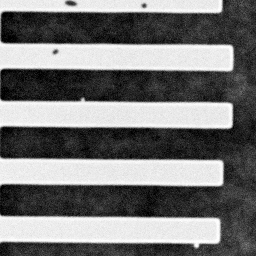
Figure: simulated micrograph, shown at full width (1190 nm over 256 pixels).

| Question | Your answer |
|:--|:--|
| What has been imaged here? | groups of lines, slits or small figures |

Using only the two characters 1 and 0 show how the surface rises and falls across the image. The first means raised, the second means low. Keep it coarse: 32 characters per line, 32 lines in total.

11111111111111111111111111110000
00000000000000000000000000000000
00000000000000000000000000000000
00000000000000000000000000000000
00000000000000000000000000000000
10000000000000000000000000000000
11111111111111111111111111111000
11111111111111111111111111111000
10000111111111111111111111111000
00000000000000000000000000000000
00000000000000000000000000000000
00000000000000000000000000000000
00000000000000000000000000000000
11111111111111111111111111111000
11111111111111111111111111111000
11111111111111111111111111111000
00000000000000000000000000000000
00000000000000000000000000000000
00000000000000000000000000000000
00000000000000000000000000000000
11111111111111111111111111110000
11111111111111111111111111110000
11111111111111111111111111110000
00000000000000000000000000000000
00000000000000000000000000000000
00000000000000000000000000000000
00000000000000000000000000000000
11111111111111111111111111100000
11111111111111111111111111100000
11111111111111111111111111100000
00000000000000000000000000000000
00000000000000000000000000000000